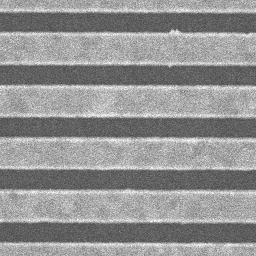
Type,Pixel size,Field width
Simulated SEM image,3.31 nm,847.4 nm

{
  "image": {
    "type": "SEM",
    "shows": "parallel lines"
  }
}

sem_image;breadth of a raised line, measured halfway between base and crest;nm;104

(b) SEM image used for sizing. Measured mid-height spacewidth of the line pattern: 0.07 microns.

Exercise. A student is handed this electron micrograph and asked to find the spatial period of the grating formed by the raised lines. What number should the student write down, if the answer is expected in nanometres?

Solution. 174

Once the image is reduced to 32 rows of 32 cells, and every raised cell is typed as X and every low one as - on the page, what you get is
XXXXXXXXXXXXXXXXXXXXXXXXXXXXXXXX
----------X--XX--X--------XXX---
--------------------------------
--------------------------------
XXXXXXXXXXXXXXXXXXXXXXXXXXXXXXXX
XXXXXXXXXXXXXXXXXXXXXXXXXXXXXXXX
XXXXXXXXXXXXXXXXXXXXXXXXXXXXXXXX
XXXXXXXXXXXXXXXXXXXXXXXXXXXXXXXX
--------------------------------
--------------------------------
--------------------------------
XXXXXXXXXXXXXXXXXXXXXXXXXXXXXXXX
XXXXXXXXXXXXXXXXXXXXXXXXXXXXXXXX
XXXXXXXXXXXXXXXXXXXXXXXXXXXXXXXX
XXXX-X--XX-XXXXXXXXXXXXXXXXXXXXX
--------------------------------
--------------------------------
XXXXXXXXXXXXXXXXXXXXXXXXXXXXXXXX
XXXXXXXXXXXXXXXXXXXXXXXXXXXXXXXX
XXXXXXXXXXXXXXXXXXXXXXXXXXXXXXXX
XXXXXXXXXXXXXXXXXXXXXXXXXXXXXXXX
--------------------------------
--------------------------------
--------------------------------
XXXXXXXXXXXXXXXXXXXXXXXXXXXXXXXX
XXXXXXXXXXXXXXXXXXXXXXXXXXXXXXXX
XXXXXXXXXXXXXXXXXXXXXXXXXXXXXXXX
XXXXXXXXXXXXXXXXXXXXXXXXXXXXXXXX
--------------------------------
--------------------------------
XXXXXXXXXXXXXXXXXXXXXXX---------
XXXXXXXXXXXXXXXXXXXXXXXXXXXXXXXX